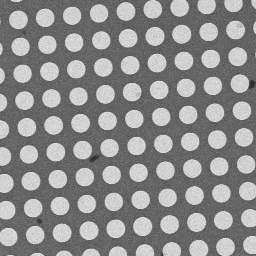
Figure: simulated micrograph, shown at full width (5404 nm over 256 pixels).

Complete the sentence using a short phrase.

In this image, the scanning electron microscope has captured an array of small figures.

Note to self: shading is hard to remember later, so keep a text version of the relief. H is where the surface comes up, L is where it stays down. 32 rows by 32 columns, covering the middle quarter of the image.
LHHHHLLLHHHHLLHHHHHLLHHHHLLLHHHH
LHHHHLLLHHHHLLLHHHLLLLHHHLLLLLLL
LHHHHLLLHHHLLLLLLLLLLLLLLLLLLLLL
LLLLLLLLLLLLLLLLLLLLLLLLLLLLLLLL
LLLLLLLLLLLLLLLLLLLLLLLHHLLLLHHH
LLLLLLLLLHHLLLLHHHHLLLHHHHLLHHHH
LLHHHLLLHHHHLLLHHHHLLLHHHHLLHHHH
LHHHHHLLHHHHHLLHHHHLLLHHHHLLLHHH
LLHHHHLLHHHHLLLHHHHLLLLHHLLLLLLL
LLHHHLLLLHHHLLLLLLLLLLLLLLLLLLLL
LLLLLLLLLLLLLLLLLLLLLLLLLLLLLLLL
LLLLLLLLLLLLLLLLLLLLLLLHHHLLLHHH
LLLLLLLLLHHHLLLLHHHLLLHHHHLLLHHH
LLHHHHLLLHHHHLLHHHHHLLHHHHLLLHHH
LLHHHHLLLHHHHLLLHHHHLLHHHHLLLLHH
LLHHHHLLLHHHHLLLHHHLLLLLLLLLLLLL
LLLHHHLLLLLLLLLLLLLLLLLLLLLLLLLL
LLLLLLLLLLLLLLLLLLLLLLLLLLLLLLLH
LLLLLLLLLLLLLLLLLHHLLLLHHHLLLLHH
LLLLHHLLLLHHHLLLHHHHLLLHHHHLLHHH
LLLHHHHLLHHHHLLLHHHHLLLHHHHLLLHH
LLLHHHHLLHHHHHLLHHHHLLLHHHLLLLLH
LLLHHHHLLLHHHLLLLHHLLLLLLLLLLLLL
LLLLHHLLLLLLLLLLLLLLLLLLLLLLLLLL
LLLLLLLLLLLLLLLLLLLLLLLLLLLLLLLH
LLLLLLLLLLLLLLLLLHHHLLLHHHHLLLHH
LLLLHHHLLLHHHHLLHHHHHLLHHHHLLLHH
LLLHHHHLLLHHHHLLLHHHHLLHHHHLLLHH
HLLHHHHLLLHHHHLLLHHHLLLLHHHLLLLL
HLLHHHHLLLLHHLLLLLLLLLLLLLLLLLLL
LLLLLLLLLLLLLLLLLLLLLLLLLLLLLLLL
LLLLLLLLLLLLLLLLLLLLLLLLLHHLLLLH